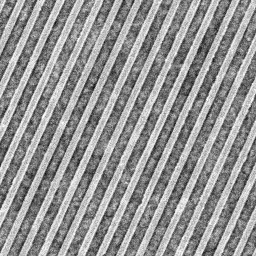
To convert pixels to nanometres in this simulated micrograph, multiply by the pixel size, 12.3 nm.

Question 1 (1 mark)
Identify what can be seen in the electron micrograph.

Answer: parallel lines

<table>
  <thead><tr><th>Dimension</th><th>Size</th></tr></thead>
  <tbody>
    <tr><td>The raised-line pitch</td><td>0.218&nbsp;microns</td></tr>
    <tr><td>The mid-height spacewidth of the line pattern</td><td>11.7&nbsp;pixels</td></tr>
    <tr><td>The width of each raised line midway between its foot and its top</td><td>67.2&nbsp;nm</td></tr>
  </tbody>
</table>